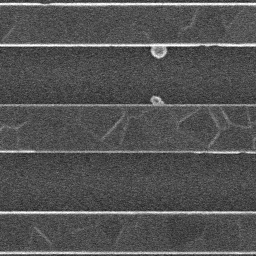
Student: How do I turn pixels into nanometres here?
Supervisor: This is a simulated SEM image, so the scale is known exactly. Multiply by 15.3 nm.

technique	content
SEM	lines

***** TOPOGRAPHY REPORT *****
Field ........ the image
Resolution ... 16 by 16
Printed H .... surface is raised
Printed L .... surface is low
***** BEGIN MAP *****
HHHHHHHHHHHHHHHH
HHHHHHHHHHHHHHHH
HHHHHHHHHHHHHHHH
LLLLLLLLLLLLLLLL
LLLLLLLLLLLLLLLL
LLLLLLLLLLLLLLLL
LLLLLLLLLLLLLLLL
HHHHHHHHHHHHHHHH
HHHHHHHHHHHHHHHH
LLLLLLLLLLLLHHHH
LLLLLLLLLLLLLLLL
LLLLLLLLLLLLLLLL
LLLLLLLLLLLLLLLL
HHHHHHHHHHHHHHHH
HHHHHHHHHHHHHHHH
HHHHHHHHHHHHHHHH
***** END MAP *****